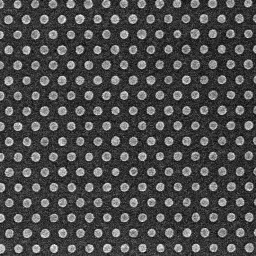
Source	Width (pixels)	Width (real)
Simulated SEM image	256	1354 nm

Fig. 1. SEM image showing a regular array of raised bodies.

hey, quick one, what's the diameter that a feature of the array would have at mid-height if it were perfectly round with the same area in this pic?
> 0.0422 microns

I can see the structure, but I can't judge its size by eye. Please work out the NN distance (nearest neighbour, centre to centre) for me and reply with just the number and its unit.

0.0918 microns